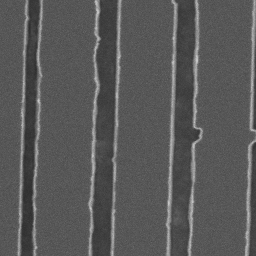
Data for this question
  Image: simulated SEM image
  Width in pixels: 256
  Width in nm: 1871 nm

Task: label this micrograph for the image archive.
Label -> one or a few lines or trenches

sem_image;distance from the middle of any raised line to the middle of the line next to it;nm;573